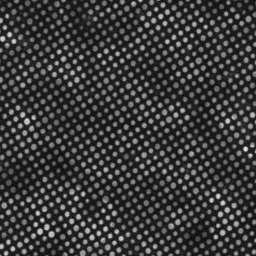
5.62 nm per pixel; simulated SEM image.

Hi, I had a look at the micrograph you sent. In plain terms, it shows a regular array of raised bodies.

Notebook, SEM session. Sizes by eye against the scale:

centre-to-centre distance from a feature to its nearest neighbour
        44.6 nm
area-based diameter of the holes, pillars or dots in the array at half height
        24.6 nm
